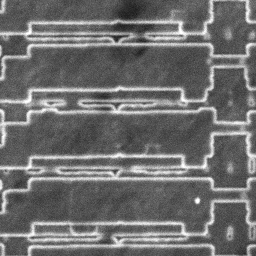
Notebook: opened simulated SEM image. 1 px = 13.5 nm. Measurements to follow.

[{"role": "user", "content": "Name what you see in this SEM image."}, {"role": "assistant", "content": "wiring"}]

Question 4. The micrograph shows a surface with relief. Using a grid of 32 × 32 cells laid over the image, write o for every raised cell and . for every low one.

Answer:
ooooooooooooooooooooooooooo....o
ooooooooooooooooooooooooooo....o
oooooooooooooooooooooooooo.....o
oooo..................oooo......
................................
..........oooooooooooooooo.....o
...oooooooooooooooooooooooo....o
oooooooooooooooooooooooooooooooo
ooooooooooooooooooooooooooo...oo
ooooooooooooooooooooooooooo....o
ooooooooooooooooooooooooooo....o
oooo...................ooo......
oooo...................ooo......
................................
...oooooooooooooooooooooooo....o
oooooooooooooooooooooooooooooooo
oooooooooooooooooooooooooooooooo
ooooooooooooooooooooooooooo....o
ooooooooooooooooooooooooooo....o
oooooooooooooooooooooooooo.....o
oooo...................ooo......
................................
....oooooooooooooooooooooo.....o
...oooooooooooooooooooooooo...oo
oooooooooooooooooooooooooooooooo
ooooooooooooooooooooooooooo....o
ooooooooooooooooooooooooooo....o
ooooooooooooooooooooooooooo....o
oooo.....oo............ooo......
................................
................................
....ooooooooooooooooooooooo....o